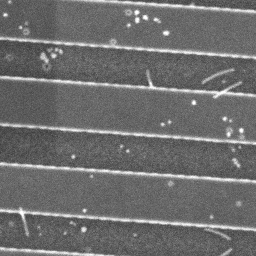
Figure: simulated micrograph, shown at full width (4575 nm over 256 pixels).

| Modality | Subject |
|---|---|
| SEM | lines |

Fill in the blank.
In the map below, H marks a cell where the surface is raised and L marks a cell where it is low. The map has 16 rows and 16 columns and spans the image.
HHHHHHHHHHHHHLLL
HHHHHHHHHHHHHHHH
LHHHHHHHHHHHHHHH
LLLLLLLLLLLLLLHH
LLLLLLLLLLLLLLLL
HHHHHHHHHHLLLLLL
HHHHHHHHHHHHHHHH
HHHHHHHHHHHHHHHH
LLLLLLLLLLHHHHHH
LLLLLLLLLLLLLLLL
HHHHHLLLLLLLLLLL
HHHHHHHHHHHHHHHH
HHHHHHHHHHHHHHHH
LLLLHHHHHHHHHHHH
LLLLLLLLLLLLLLLL
LLLLLLLLLLLLLLLL